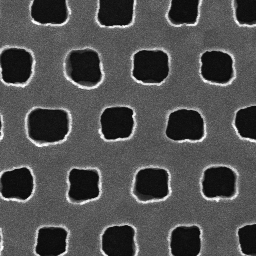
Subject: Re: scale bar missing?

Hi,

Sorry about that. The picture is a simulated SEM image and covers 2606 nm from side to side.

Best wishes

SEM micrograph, a regular array of holes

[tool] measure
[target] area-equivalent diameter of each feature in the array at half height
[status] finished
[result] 345 nm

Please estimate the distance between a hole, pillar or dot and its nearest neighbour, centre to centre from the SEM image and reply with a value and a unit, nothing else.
671 nm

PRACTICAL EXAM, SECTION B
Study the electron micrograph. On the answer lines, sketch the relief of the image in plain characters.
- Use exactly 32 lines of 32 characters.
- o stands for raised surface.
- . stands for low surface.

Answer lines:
oooo....oooo.....oooo....ooooo..
oooo....oooo.....oooo....ooooo..
oooo....oooo....ooooo...oooooo..
oooooooooooooooooooooooooooooooo
oooooooooooooooooooooooooooooooo
oooooooooooooooooooooooooooooooo
...oooooo...ooooo...oooooo..oooo
....ooooo...ooooo....oooo....ooo
....ooooo...ooooo....oooo....ooo
....ooooo....oooo....oooo....ooo
oooooooooo.ooooooooooooooooooooo
oooooooooooooooooooooooooooooooo
oooooooooooooooooooooooooooooooo
oooooooooooooo..ooooooooooooooo.
oooo....ooooo....oooo....oooo...
oooo....ooooo....oooo....oooo...
oooo....ooooo...ooooo....ooooo..
oooo....oooooooooooooo.ooooooooo
oooooooooooooooooooooooooooooooo
oooooooooooooooooooooooooooooooo
oooooooooooooooooooooooooooooooo
o...ooooo...ooooo....ooooo...ooo
....ooooo...ooooo....oooo....ooo
....ooooo...ooooo....oooo....ooo
....ooooo...ooooo....ooooo.o.ooo
oooooooooooooooooooooooooooooooo
oooooooooooooooooooooooooooooooo
oooooooooooooooooooooooooooooooo
oooooo.ooooooo..oooooo...ooooo..
ooooo...ooooo....oooo....ooooo..
ooooo...ooooo....oooo....ooooo..
ooooo...ooooo....oooo....ooooo..